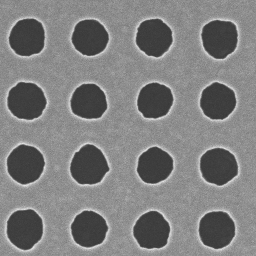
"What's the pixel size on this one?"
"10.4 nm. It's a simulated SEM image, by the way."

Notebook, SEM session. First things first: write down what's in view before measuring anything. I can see a regular array of holes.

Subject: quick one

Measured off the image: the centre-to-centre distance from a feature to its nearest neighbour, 654 nm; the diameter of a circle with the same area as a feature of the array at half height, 387 nanometers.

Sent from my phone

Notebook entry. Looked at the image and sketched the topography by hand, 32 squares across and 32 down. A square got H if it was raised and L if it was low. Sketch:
HHHHHHHHHHHHHHHHHHHHHHHHHHHHHHHH
HHHHHHHHHHHHHHHHHHHHHHHHHHHHHHHH
HHHLLHHHHHLLHHHHHHLLHHHHHHHHHHHH
HHLLLHHHHLLLLHHHHLLLLHHHHLLLLLHH
HLLLLLHHHLLLLLHHHLLLLHHHHLLLLLHH
HLLLLLHHHLLLLHHHHLLLLHHHHLLLLLHH
HHLLLHHHHHLLLHHHHHLLLHHHHHLLLHHH
HHHHHHHHHHHHHHHHHHHHHHHHHHHHHHHH
HHHHHHHHHHHHHHHHHHHHHHHHHHHHHHHH
HHHHHHHHHHHHHHHHHHHHHHHHHHHHHHHH
HHLLHHHHHHHHHHHHHHHLHHHHHHHLHHHH
HLLLLHHHHLLLLHHHHLLLLHHHHLLLLHHH
HLLLLLHHHLLLLHHHHLLLLLHHHLLLLHHH
HLLLLLHHHLLLLHHHHLLLLHHHHLLLLHHH
HHLLLHHHHHLLLHHHHHLLHHHHHHLLHHHH
HHHHHHHHHHHHHHHHHHHHHHHHHHHHHHHH
HHHHHHHHHHHHHHHHHHHHHHHHHHHHHHHH
HHHHHHHHHHHHHHHHHHHHHHHHHHHHHHHH
HHLLHHHHHHLLHHHHHHHLHHHHHHHHHHHH
HLLLLHHHHLLLLHHHHHLLLHHHHLLLLHHH
HLLLLLHHHLLLLHHHHLLLLLHHHLLLLLHH
HLLLLHHHHLLLLHHHHLLLLHHHHLLLLLHH
HHLLLHHHHLLLLHHHHHLLHHHHHHLLLHHH
HHHHHHHHHHHHHHHHHHHHHHHHHHHHHHHH
HHHHHHHHHHHHHHHHHHHHHHHHHHHHHHHH
HHHHHHHHHHHHHHHHHHHHHHHHHHHHHHHH
HHLLHHHHHHLLHHHHHHHLHHHHHHLLHHHH
HLLLLHHHHLLLLHHHHLLLLHHHHLLLLHHH
HLLLLHHHHLLLLHHHHLLLLHHHHLLLLHHH
HLLLLHHHHLLLLHHHHLLLLHHHHLLLLHHH
HHLLHHHHHHLLHHHHHLLLLHHHHHLLLHHH
HHHHHHHHHHHHHHHHHHHHHHHHHHHHHHHH